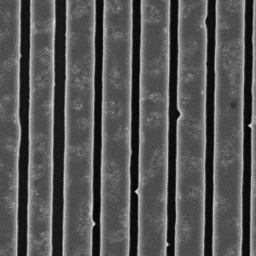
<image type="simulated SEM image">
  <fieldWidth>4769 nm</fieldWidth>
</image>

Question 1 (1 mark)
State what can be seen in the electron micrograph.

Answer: parallel lines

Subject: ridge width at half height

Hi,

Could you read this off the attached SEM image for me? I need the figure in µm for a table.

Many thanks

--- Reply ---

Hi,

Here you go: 0.543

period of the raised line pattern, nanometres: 699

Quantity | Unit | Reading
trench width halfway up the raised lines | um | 0.163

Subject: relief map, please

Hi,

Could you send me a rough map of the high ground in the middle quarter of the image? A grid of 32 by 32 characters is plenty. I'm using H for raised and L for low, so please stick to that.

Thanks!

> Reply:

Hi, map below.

HHHHHHHHLLHHHHHHHLLHHHHHHHLLLHHH
HHHHHHHHLLHHHHHHHLLHHHHHHHLLHHHH
HHHHHHHLLLHHHHHHHLLHHHHHHHLLHHHH
LHHHHHHLLLHHHHHHHLLHHHHHHHLLLHHH
HHHHHHHLLLHHHHHHHLLHHHHHHHLLLHHH
HHHHHHHLLLHHHHHHHLLHHHHHHHLLHHHH
HHHHHHHLLLHHHHHHHLLHHHHHHHLLHHHH
HHHHHHHLLLHHHHHHHLLHHHHHHHLLHHHH
HHHHHHHLLLHHHHHHHLLHHHHHHHLLHHHH
HHHHHHHLLLHHHHHHHLLHHHHHHHLLHHHH
HHHHHHHLLLHHHHHHHLLHHHHHHHLLHHHH
HHHHHHHLLLHHHHHHHLLHHHHHHHLLHHHH
HHHHHHHLLLHHHHHHHLLHHHHHHHLLLHHH
HHHHHHHLLLHHHHHHHLLHHHHHHHLLHHHH
HHHHHHHLLLHHHHHHHLLHHHHHHHLLHHHH
HHHHHHHLLHHHHHHHHLLHHHHHHHLLHHHH
HHHHHHHLLHHHHHHHHLLHHHHHHHLLHHHH
HHHHHHHLLHHHHHHHHLLHHHHHHHLLHHHH
HHHHHHHLLHHHHHHHLLLHHHHHHHLLHHHH
HHHHHHHLLHHHHHHHHLLHHHHHHHLLHHHH
HHHHHHHLLHHHHHHHHLLHHHHHHHLLHHHH
HHHHHHHLLHHHHHHHHLLHHHHHHHLLHHHH
HHHHHHHLLHHHHHHHHLLHHHHHHHLLHHHH
HHHHHHHLLHHHHHHHLLLHHHHHHHLLHHHH
HHHHHHHLLHHHHHHHLLLHHHHHHHLLHHHH
HHHHHHHLLHHHHHHHLLLHHHHHHHLLHHHH
HHHHHHHLLHHHHHHHLLLHHHHHHHLLHHHH
HHHHHHHLLHHHHHHHLLLHHHHHHHLLHHHH
HHHHHHHLLHHHHHHHHLLHHHHHHHLLHHHH
HHHHHHHLLHHHHHHHHLLHHHHHHHLLHHHH
HHHHHHHLLHHHHHHHHLLHHHHHHHLLHHHH
HHHHHHHLLHHHHHHHHLHHHHHHHHLLHHHH